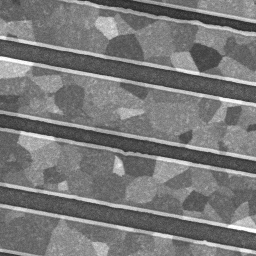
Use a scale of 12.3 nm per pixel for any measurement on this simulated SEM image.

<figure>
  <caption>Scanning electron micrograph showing one or a few lines or trenches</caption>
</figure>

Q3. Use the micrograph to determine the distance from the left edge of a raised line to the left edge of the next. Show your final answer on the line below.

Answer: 873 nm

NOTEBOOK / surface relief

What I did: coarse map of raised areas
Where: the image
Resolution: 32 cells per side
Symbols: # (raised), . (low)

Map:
###########.........############
#################.........######
######################........##
############################....
################################
.....###########################
..........######################
#..............#################
#######..............###########
############..............######
##################..............
#######################.........
############################....
################################
...#############################
........########################
##............##################
########...........#############
#############...........########
##################............##
########################........
##############################..
################################
...#############################
........########################
.............###################
####...............#############
##########..............########
################..............##
#####################...........
##########################......
.###############################